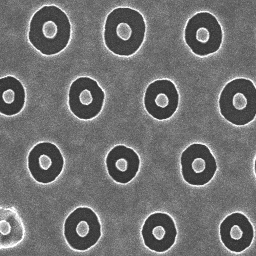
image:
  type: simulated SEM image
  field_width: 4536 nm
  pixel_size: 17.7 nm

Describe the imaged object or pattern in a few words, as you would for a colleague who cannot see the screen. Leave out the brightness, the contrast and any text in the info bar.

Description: a regular array of ring-shaped grooves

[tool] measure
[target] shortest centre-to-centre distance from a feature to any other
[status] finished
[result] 1340 nm